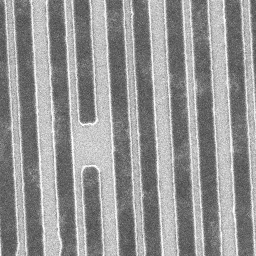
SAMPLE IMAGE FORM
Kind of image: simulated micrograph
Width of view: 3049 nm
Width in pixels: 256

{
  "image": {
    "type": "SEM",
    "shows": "parallel lines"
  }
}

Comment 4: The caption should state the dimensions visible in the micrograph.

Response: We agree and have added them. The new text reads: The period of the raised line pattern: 30 px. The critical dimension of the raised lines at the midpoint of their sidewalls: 232 nanometres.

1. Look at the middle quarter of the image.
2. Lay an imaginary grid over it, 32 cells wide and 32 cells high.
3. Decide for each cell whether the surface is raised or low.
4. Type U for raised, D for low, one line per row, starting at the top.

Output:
UDDUUUUDDDDUUUUUDDUUUUDDDDUUUUUD
UDDUUUUUDDDUUUUUDUUUUUDDDDUUUUUD
UDDUUUUUDDDUUUUUDDUUUUDDDDUUUUUD
UDDUUUUUDDDUUUUUDDUUUUDDDDUUUUUD
UDDUUUUUDDDUUUUUDDUUUUDDDDUUUUUD
UDDUUUUUDDDUUUUUDDUUUUDDDDUUUUUD
UDDUUUUUDDDUUUUUDDUUUUDDDDUUUUUD
UDDUUUUUDDDUUUUUDDUUUUDDDDUUUUUD
UUDUUUUUDDDUUUUUDDUUUUUDDDUUUUUD
UUDUUUUUDDDDUUUUDDUUUUUDDDUUUUUD
UUDDUUUUDDDDUUUUDDUUUUUDDDUUUUUD
UUDDUUUUDDDDUUUUDDUUUUUDDDUUUUUD
UUDDUUUUDDDDUUUUDDUUUUUDDDDUUUUD
UUDDUUUUDDDDUUUUDDUUUUUDDDDUUUUD
UUDDUUUUDDDDUUUUDDUUUUUDDDDUUUUD
UUDDDDDDDDDDUUUUUDUUUUUDDDDUUUUD
UUDDDDDDDDDDUUUUUDUUUUUDDDDUUUUD
UUDDDDDDDDDDUUUUUDDUUUUDDDDUUUUD
UUDDDDDDDDDDUUUUUDUUUUUDDDDUUUUU
UUDDDDDDDDDDUUUUUDDUUUUDDDDUUUUU
UUDDDDDDDDDDUUUUUDDUUUUDDDDUUUUU
UUDDDDDDDDDDUUUUUDDUUUUDDDDUUUUU
UUDDDDDDDDDDUUUUUDDUUUUDDDDUUUUU
UUDDDDDDDDDDUUUUUDDUUUUUDDDUUUUU
UUDDDDDDDDDDUUUUUDDUUUUDDDDUUUUU
UUDDDDDUDDDDUUUUUDDUUUUDDDDUUUUU
UUDDDUUUUDDDUUUUUDDUUUUDDDDUUUUU
UUUDUUUUUDDDUUUUUDDUUUUUDDDUUUUU
UUUDUUUUUDDDDUUUUDDUUUUUDDDUUUUU
UUUDDUUUUDDDDUUUUDDUUUUUDDDUUUUU
UUUDDUUUUDDDDUUUUDDUUUUUDDDDUUUU
UUUDDUUUUDDDDUUUUDDUUUUUDDDDUUUU